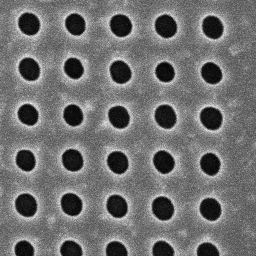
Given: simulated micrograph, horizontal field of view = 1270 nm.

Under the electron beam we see a regular array of holes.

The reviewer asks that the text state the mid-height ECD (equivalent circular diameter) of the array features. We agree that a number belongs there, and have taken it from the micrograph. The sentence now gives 0.113 microns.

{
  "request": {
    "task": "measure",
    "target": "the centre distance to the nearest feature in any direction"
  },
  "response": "222 nanometres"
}